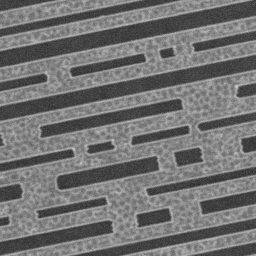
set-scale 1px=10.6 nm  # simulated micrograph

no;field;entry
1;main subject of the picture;parallel lines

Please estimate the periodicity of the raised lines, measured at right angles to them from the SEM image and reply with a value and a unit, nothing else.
279 nanometres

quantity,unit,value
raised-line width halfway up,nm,136